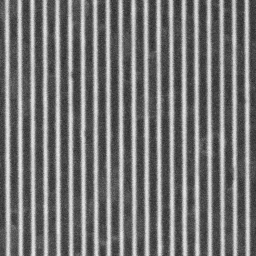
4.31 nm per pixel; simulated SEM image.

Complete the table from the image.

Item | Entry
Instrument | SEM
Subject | parallel lines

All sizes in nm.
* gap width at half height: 44.7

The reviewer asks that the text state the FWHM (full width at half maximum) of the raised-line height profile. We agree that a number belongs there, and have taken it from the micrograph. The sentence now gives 2.37 px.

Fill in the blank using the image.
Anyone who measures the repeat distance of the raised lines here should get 54.3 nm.